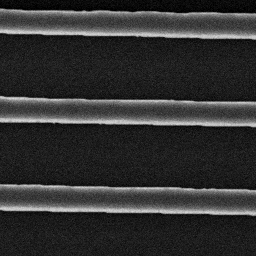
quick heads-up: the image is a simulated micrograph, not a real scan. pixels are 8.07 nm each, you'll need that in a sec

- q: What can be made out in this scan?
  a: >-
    lines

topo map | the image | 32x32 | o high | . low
................................
oooooooooooooooooooo............
oooooooooooooooooooooooooooooooo
oooooooooooooooooooooooooooooooo
..................oooooooooooooo
................................
................................
................................
................................
................................
................................
................................
ooooooooooo.....................
oooooooooooooooooooooooooooooooo
oooooooooooooooooooooooooooooooo
....................oooooooooooo
................................
................................
................................
................................
................................
................................
................................
ooooooooooooooooooooooo.........
oooooooooooooooooooooooooooooooo
oooooooooooooooooooooooooooooooo
...............ooooooooooooooooo
................................
................................
................................
................................
................................